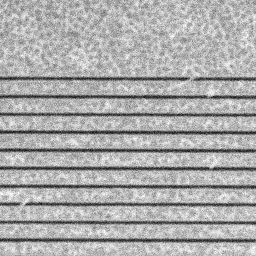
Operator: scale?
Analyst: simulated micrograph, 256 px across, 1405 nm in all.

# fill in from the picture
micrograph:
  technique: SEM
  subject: parallel lines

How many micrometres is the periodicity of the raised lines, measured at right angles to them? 0.0986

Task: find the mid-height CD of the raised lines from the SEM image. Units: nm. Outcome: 74.1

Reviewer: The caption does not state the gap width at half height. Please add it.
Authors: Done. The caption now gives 24.7 nm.